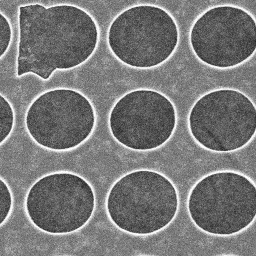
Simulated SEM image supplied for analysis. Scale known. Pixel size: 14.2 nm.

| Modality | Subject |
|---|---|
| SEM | holes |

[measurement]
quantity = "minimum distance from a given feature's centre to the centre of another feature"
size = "1170 nm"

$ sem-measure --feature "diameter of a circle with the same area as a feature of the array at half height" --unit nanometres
920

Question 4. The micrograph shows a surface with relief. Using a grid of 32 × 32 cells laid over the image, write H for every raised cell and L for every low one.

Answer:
HHHHHHHHHHHHHHHHHHHHHHHHHHHHHHHH
HHLLLLLLLLLHHHHLLLLLLHHHHHLLLLLH
LHLLLLLLLLLLHHLLLLLLLLHHHLLLLLLL
LHLLLLLLLLLLHHLLLLLLLLHHLLLLLLLL
LHLLLLLLLLLLHHLLLLLLLLHHLLLLLLLL
LHLLLLLLLLLLHHLLLLLLLLHHLLLLLLLL
LHLLLLLLLLLLHHLLLLLLLLHHLLLLLLLL
HHLLLLLLLLLHHHHLLLLLLHHHHLLLLLLH
HHLLLLLLLHHHHHHHHHHHHHHHHHHHHHHH
HHHHHLHHHHHHHHHHHHHHHHHHHHHHHHHH
HHHHHHHHHHHHHHHHHHHHHHHHHHHHHHHH
HHHHHHLLLHHHHHHHHLLHHHHHHHHLLLHH
LHHHLLLLLLLHHHHLLLLLLHHHHLLLLLLH
LHHHLLLLLLLLHHLLLLLLLLHHLLLLLLLL
LLHLLLLLLLLLHHLLLLLLLLHHLLLLLLLL
LLHLLLLLLLLLHHLLLLLLLLHHLLLLLLLL
LHHHLLLLLLLHHHLLLLLLLLHHLLLLLLLL
LHHHLLLLLLLHHHHLLLLLLHHHHLLLLLLH
HHHHHHLLLHHHHHHHLLLHHHHHHHLLLLHH
HHHHHHHHHHHHHHHHHHHHHHHHHHHHHHHH
HHHHHHHHHHHHHHHHHHHHHHHHHHHHHHHH
HHHHHHHHHHHHHHHHHLLHHHHHHHHHLHHH
HHHHHLLLLLHHHHHLLLLLLHHHHLLLLLLH
LHHHLLLLLLLHHHLLLLLLLLHHLLLLLLLL
LHHHLLLLLLLLHHLLLLLLLLHHLLLLLLLL
LHHLLLLLLLLLHLLLLLLLLLHHLLLLLLLL
LHHLLLLLLLLLHHLLLLLLLLHHLLLLLLLL
LHHHLLLLLLLHHHLLLLLLLHHHLLLLLLLL
HHHHHLLLLLHHHHHLLLLLHHHHHLLLLLLH
HHHHHHHHHHHHHHHHHHHHHHHHHHHHHHHH
HHHHHHHHHHHHHHHHHHHHHHHHHHHHHHHH
HHHHHHHHHHHHHHHHHHHHHHHHHHHHHHHH